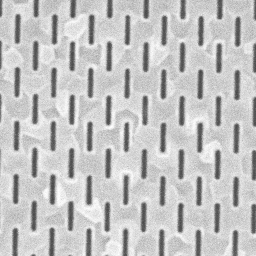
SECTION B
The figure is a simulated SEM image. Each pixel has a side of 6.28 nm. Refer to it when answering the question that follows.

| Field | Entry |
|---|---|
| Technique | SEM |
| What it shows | a regular array of holes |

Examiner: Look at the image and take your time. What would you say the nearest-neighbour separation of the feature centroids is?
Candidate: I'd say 0.202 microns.